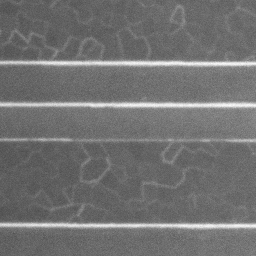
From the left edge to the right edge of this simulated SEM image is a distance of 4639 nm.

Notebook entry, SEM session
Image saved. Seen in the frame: lines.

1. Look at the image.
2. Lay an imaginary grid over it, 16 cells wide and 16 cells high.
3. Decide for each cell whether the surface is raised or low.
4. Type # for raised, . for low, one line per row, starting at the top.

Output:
################
################
################
################
................
................
................
................
................
################
################
################
################
################
................
................